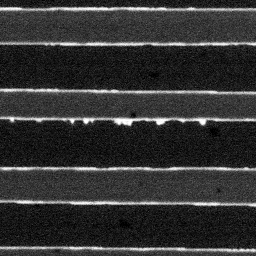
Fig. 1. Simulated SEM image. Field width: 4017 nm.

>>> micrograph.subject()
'lines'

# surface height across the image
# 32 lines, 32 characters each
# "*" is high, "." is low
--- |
................................
********************************
********************************
********************************
********************************
........**********.*********...*
................................
................................
................................
................................
................................
***************************.....
********************************
********************************
********************************
................................
................................
................................
................................
................................
................................
********************************
********************************
********************************
********************************
........................********
................................
................................
................................
................................
................................
********************************